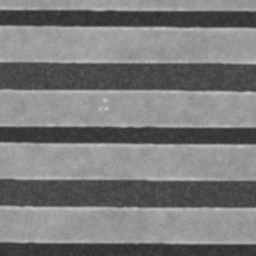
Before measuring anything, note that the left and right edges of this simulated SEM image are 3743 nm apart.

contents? lines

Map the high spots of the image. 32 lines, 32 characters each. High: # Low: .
################################
................................
................................
######################..#.......
################################
################################
################################
################################
................................
................................
................................
#############################...
################################
################################
################################
################################
................................
................................
################################
################################
################################
################################
..................##############
................................
................................
................................
################################
################################
################################
################################
................................
................................